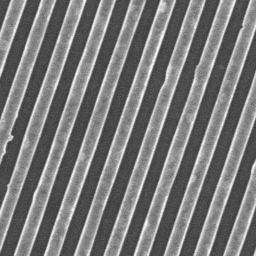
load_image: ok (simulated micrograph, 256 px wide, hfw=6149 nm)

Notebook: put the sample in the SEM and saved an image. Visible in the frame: parallel lines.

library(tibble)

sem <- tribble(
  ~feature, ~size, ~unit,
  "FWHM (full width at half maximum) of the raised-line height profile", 307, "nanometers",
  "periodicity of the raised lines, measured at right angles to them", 680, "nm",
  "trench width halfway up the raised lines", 0.372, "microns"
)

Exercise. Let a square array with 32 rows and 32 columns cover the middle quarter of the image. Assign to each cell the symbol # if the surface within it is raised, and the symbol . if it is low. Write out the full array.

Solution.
....###....####....###....####..
...####....###.....###....###...
...####....###....###.....###...
...###....####....###.....##....
..####....###.....###....###....
..####...####....###.....###....
..###....####....###....###.....
.####....###....####....###....#
.####...####....####...####....#
.###....####....###....###.....#
####....###....####....###....##
####...####....####....###....##
###....####....###....###.....##
###....###....####....###....###
###...####....###.....###....###
##....####....###....####...####
##....###....####....###....####
#....####....###.....###....###.
#....####....###....####...####.
#....###....####....###....####.
#....###....###.....###....###..
....####....###....####...####..
....###....####....###....####..
....###....###.....###....###...
...####...####....####...####...
...###....####....###....####...
...###....###....####....###....
..####...####....####....###....
..###....####....###....####....
..###....###....####....###....#
.###....####....####....###....#
.###....###.....###....###.....#